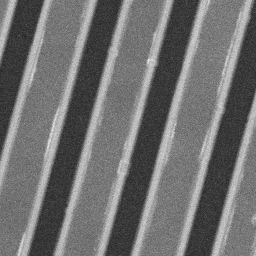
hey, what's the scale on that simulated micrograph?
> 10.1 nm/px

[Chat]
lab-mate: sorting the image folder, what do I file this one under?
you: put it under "one or a few lines or trenches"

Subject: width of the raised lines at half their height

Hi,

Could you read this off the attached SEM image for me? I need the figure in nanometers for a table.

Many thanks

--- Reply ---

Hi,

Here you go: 432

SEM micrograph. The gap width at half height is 33.4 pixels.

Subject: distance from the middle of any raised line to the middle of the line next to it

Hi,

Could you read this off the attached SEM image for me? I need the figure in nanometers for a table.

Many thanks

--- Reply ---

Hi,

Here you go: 760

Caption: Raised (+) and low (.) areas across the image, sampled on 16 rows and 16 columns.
+..+++..++...++.
...++...++..+++.
..+++..+++..+++.
..+++..+++..+++.
..+++..++...++..
.+++..+++..+++..
.+++..+++..+++..
.+++..+++..+++..
.+++..++..+++..+
+++..+++..+++..+
+++..+++..+++..+
+++..++...++...+
++...++..+++..++
++..+++..+++..++
++..+++..+++..++
++..++...++...++